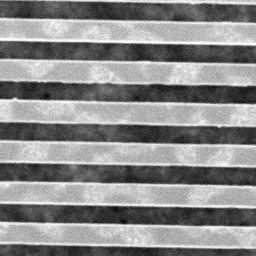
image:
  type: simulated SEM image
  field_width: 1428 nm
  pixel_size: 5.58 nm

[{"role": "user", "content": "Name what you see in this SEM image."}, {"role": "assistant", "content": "parallel lines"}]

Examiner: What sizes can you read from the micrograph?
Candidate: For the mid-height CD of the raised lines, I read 114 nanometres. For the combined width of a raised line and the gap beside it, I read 227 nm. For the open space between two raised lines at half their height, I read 0.109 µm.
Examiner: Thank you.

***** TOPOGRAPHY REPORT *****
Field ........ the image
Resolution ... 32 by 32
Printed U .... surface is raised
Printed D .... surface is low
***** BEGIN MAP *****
DDDDDDDDDDDDDDDDDDDDDDDDDDDDDDDD
DDDDDDDDDDDDDDDDDDDDDDDDDDDDDDDD
UUUDDUUUDDDDDDDDDDDDDDDDDDDDDDDD
UUUUUUUUUUUUUUUUUUUUUUUUUUUUUUUU
UUUUUUUUUUUUUUUUUUUUUUUUUUUUUUUU
DDDDDDDDDDDDDDDDDDDDDDDDDDDDDDDU
DDDDDDDDDDDDDDDDDDDDDDDDDDDDDDDD
UUDDDDDDDDDDDDDDDDDDDDDDDDDDDDDD
UUUUUUUUUUUUUUUUUUUUUUUUUUUUUUUU
UUUUUUUUUUUUUUUUUUUUUUUUUUUUUUUU
DDDDDDDDDDDDDDDDDDDDUUUUUUUUUUUU
DDDDDDDDDDDDDDDDDDDDDDDDDDDDDDDD
DUDDDDDDDDDDDDDDDDDDDDDDDDDDDDDD
UUUUUUUUUUUUUUUUUUUUUUUUUUUUUUUU
UUUUUUUUUUUUUUUUUUUUUUUUUUUUUUUU
DDDDDDDDDDDDDDDDDDDUUUUUUUUUUUUU
DDDDDDDDDDDDDDDDDDDDDDDDDDDDDDDD
DDDDDDDDDDDDDDDDDDDDDDDDDDDDDDDD
UUUUUUUUUUUUUUUUUUUUUUUUUUUUUUUU
UUUUUUUUUUUUUUUUUUUUUUUUUUUUUUUU
DDDDDDDDDDDDDDDDDDUUUUUUUUUUUUUU
DDDDDDDDDDDDDDDDDDDDDDDDDDDDDDDD
DDDDDDDDDDDDDDDDDDDDDDDDDDDDDDDD
UUUUUUUUUUUUUUUUUUUUUUUUUUUUUUUU
UUUUUUUUUUUUUUUUUUUUUUUUUUUUUUUU
DDDDDDDDUUUUDUUUUUUUUUUUUUUUUUUU
DDDDDDDDDDDDDDDDDDDDDDDDDDDDDDDD
DDDDDDDDDDDDDDDDDDDDDDDDDDDDDDDD
UUUUUUUUUUUUUUUUUUUUUUUUUUUUUUUD
UUUUUUUUUUUUUUUUUUUUUUUUUUUUUUUU
DDDDDDDUUUUUUUUUUUUUUUUUUUUUUUUU
DDDDDDDDDDDDDDDDDDDDDDDDDDDDDDDD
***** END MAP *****